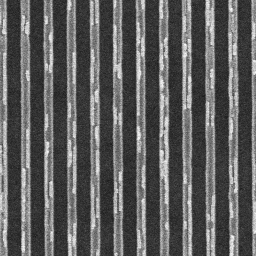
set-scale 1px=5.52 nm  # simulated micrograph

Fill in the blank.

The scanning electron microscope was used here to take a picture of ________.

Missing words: parallel lines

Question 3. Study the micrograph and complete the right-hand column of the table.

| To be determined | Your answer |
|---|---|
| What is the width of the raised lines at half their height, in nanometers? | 48.3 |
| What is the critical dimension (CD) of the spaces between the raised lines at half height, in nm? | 82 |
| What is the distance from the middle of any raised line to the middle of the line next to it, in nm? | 127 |